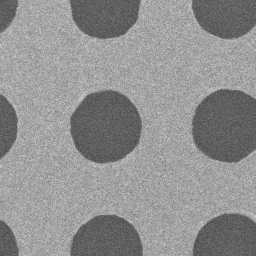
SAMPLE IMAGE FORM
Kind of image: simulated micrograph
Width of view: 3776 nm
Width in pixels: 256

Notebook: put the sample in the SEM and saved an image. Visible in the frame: holes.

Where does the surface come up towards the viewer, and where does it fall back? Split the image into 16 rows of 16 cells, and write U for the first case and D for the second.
DUUUDDDDDUUUDDDD
DUUUUDDDUUUUDDDD
UUUUUUUUUUUUUUUU
UUUUUUUUUUUUUUUU
UUUUUUUUUUUUUUUU
UUUUUUUUUUUUUUUU
DUUUUDDDUUUUDDDD
DUUUDDDDDUUUDDDD
DUUUDDDDDUUUDDDD
UUUUUDDDUUUUUDDD
UUUUUUUUUUUUUUUU
UUUUUUUUUUUUUUUU
UUUUUUUUUUUUUUUU
UUUUUUDUUUUUUUDU
DUUUUDDDDUUUDDDD
DUUUDDDDDUUUDDDD